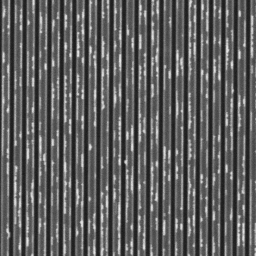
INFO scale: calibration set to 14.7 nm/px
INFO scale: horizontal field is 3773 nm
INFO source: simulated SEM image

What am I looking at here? parallel lines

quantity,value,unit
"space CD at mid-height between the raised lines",70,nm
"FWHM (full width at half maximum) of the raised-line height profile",0.112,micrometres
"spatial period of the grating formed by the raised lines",183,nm